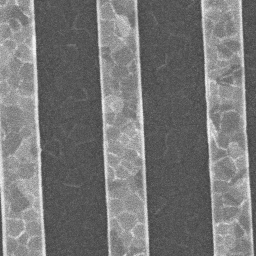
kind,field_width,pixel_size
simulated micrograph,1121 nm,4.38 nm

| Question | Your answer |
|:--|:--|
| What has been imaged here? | one or a few lines or trenches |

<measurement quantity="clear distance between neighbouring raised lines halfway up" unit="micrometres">0.286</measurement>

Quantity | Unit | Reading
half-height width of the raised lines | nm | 168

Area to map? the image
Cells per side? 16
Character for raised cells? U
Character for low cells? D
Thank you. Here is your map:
UUDDDDUUUDDDDUUD
UUDDDDUUUDDDDUUD
UUDDDDUUUDDDDUUD
UUDDDDUUUDDDDUUD
UUDDDDUUUDDDDUUD
UUDDDDUUUDDDDUUD
UUDDDDUUUDDDDUUD
UUDDDDUUUDDDDUUD
UUDDDDDUUDDDDUUD
UUDDDDDUUDDDDUUD
UUUDDDDUUDDDDUUD
UUUDDDDUUDDDDUUU
UUUDDDDUUDDDDUUU
UUUDDDDUUDDDDUUU
UUUDDDDUUDDDDUUU
UUUDDDDUUDDDDUUU